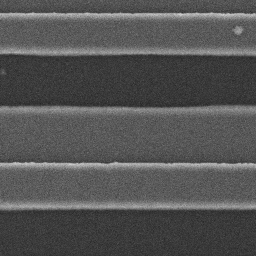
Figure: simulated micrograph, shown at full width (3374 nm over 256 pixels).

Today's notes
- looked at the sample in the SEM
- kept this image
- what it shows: lines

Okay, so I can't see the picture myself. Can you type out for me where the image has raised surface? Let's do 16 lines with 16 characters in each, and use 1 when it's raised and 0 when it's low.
1111111111111111
1111111111111111
1111111111111111
0000000000000000
0000000000000000
0000000000000000
0000000000000000
1111111111111111
1111111111111111
1111111111111111
1111111111111111
1111111111111111
1111111111111111
0000000000000000
0000000000000000
0000000000000000